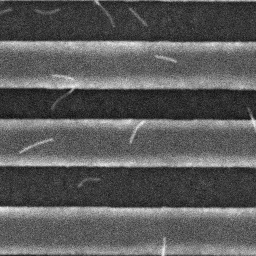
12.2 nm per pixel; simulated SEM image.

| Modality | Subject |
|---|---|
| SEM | lines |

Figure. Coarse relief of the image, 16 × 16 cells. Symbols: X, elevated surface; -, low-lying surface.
----------------
----------------
----------------
XXXXXXXXXXXXXXXX
XXXXXXXXXXXXXXXX
----X--XX--XXXXX
----------------
X-XXXXX--XX----X
XXXXXXXXXXXXXXXX
XXXXXXXXXXXXXXXX
----------------
----------------
----------------
XXXXXXXXXXXXXXXX
XXXXXXXXXXXXXXXX
XXXXXXXXXXXXXXXX